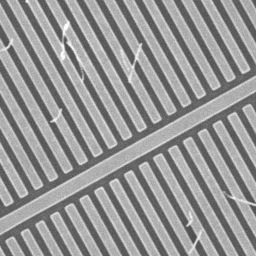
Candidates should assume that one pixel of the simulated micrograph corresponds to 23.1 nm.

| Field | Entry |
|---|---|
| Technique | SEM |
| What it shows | groups of lines, slits or small figures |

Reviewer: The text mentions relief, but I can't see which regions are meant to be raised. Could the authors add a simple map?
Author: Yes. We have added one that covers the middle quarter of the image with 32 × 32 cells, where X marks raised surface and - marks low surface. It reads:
XX---XX--XXX--XXX--XXX--XXX--XXX
XXX--XXX--XXX--XX---XX---XX--XXX
-XXX--XX---XX---XX--XXX--XXX--XX
-XXX--XXX--XXX--XXX--XXX--XX---X
--XXX--XX---XX--XXX--XXX--XXX--X
---XX--XXX--XXX--XXX--XXX--XX---
X--XXX--XXX--XXX--XX---XX--XXX--
X---XX---XX--XXX--XXX--XXX--XXX-
XX--XXX--XXX--XXX--XX---XX--XXX-
XXX--XX---XX---XX--XXX--XXX--XXX
-XX--XXX--XXX--XXX--XXX--XX-----
-XXX--XXX--XX---XX---XX--XXX----
--XX---XX--XXX--XXX--XXX--X----X
--XXX--XXX--XXX--XX---XX-----XXX
---XX---XX--XXX--XXX--X----XXXXX
X--XXX--XXX--XXX--XX-----XXXXXXX
X---XXX--XX--XXX---X----XXXXXXX-
XX--XXX--XXX--XXX-----XXXXXXX---
XXX--XXX--XXX--X----XXXXXXX----X
-XX--XXX--XXX-----XXXXXXX-----XX
-XXX--XXX--XX----XXXXXXX------XX
--XX---XX------XXXXXXX----XXX--X
--XXX--XX----XXXXXXX-------XX---
X--XXX-----XXXXXXX-----XX--XXX--
X--XX-----XXXXXX-------XX---XX--
XX------XXXXXXX----XX--XXX--XXX-
XX----XXXXXXX------XXX--XXX--XX-
----XXXXXXX----XX---XX---XX--XXX
---XXXXXX------XXX--XXX--XXX--XX
-XXXXXXX----XX--XXX--XX---XX---X
XXXXXX------XX---XX--XXX--XXX--X
XXXX----XX--XXX--XXX--XXX--XX---